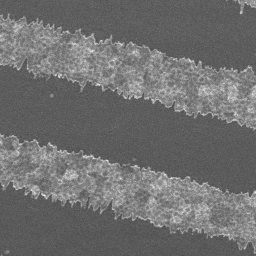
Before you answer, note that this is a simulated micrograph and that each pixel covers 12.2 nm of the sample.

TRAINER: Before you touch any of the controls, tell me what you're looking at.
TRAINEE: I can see one or a few lines or trenches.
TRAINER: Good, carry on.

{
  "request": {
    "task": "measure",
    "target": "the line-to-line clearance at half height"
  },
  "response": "0.829 micrometres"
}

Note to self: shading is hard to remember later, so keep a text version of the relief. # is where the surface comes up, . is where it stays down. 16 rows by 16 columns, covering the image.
................
##..............
######..........
##########......
..##############
.......#########
..........######
..............##
................
####............
#########.......
#############...
....############
........########
.............###
................